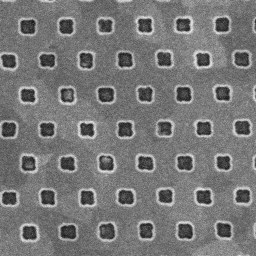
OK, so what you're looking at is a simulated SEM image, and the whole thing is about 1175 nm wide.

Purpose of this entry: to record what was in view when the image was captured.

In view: a regular array of holes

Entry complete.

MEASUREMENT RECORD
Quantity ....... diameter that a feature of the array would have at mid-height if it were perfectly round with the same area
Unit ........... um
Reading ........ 0.0772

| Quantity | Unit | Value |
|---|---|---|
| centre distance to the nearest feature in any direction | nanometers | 177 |